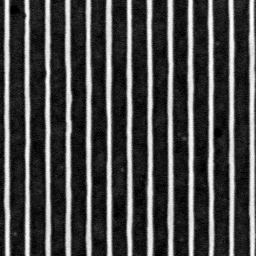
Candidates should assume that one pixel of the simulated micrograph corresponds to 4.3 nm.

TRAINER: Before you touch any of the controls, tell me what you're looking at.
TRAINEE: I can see parallel lines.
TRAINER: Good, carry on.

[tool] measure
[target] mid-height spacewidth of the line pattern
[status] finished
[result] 70.5 nanometres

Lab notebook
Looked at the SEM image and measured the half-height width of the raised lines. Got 18.3 nm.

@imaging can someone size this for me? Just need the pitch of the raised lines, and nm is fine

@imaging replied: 87.9